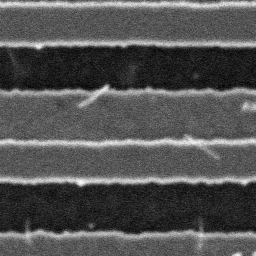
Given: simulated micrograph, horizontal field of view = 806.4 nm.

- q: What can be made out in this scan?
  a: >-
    lines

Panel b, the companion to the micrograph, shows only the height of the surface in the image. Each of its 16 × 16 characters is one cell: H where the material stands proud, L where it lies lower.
HHHHHHHHHHHHHHHH
HHHHHHHHHHHHHHHH
HHHHHHHHHHHHHHHH
LLLLLLLLLLLLLLLL
LLLLLLLLLLLLLLLL
LLLLLLLLLLLLLLLL
HHHHHHHHHHHHHHHH
HHHHHHHHHHHHHHHH
HHHHHHHHHHHHHHHH
HHHHHHHHHHHHHHHH
HHHHHHHHHHHHHHHH
LLLLLLLLLLLLLLLL
LLLLLLLLLLLLLLLL
LLLLLLLLLLLLLLLL
LLHLLLLLLLLHLLLL
HHHHHHHHHHHHHHHH